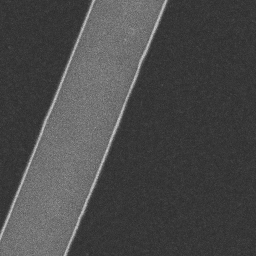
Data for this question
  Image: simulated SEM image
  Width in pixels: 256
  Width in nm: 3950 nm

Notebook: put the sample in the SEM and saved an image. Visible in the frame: one or a few lines or trenches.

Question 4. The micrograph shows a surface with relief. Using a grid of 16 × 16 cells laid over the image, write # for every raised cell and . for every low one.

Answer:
######....######
#####.....######
#####....#######
####.....#######
####.....#######
####....########
###.....########
###....#########
###....#########
##.....#########
##....##########
#.....##########
#....###########
#....###########
.....###########
....############